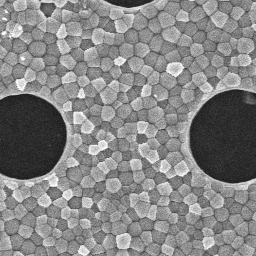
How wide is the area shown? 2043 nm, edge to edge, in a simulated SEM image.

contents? holes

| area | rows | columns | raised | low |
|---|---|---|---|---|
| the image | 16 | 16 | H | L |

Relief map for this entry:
HHHHHHHHHHHHHHHH
HHHHHHHHHHHHHHHH
HHHHHHHHHHHHHHHH
HHHHHHHHHHHHHHHH
HHHHHHHHHHHHHHHH
HHHHHHHHHHHHHHHH
LLLHHHHHHHHHHLLL
LLLLHHHHHHHHLLLL
LLLLHHHHHHHHLLLL
LLLLHHHHHHHHLLLL
LLLHHHHHHHHHHLLL
HHHHHHHHHHHHHHHH
HHHHHHHHHHHHHHHH
HHHHHHHHHHHHHHHH
HHHHHHHHHHHHHHHH
HHHHHHHHHHHHHHHH